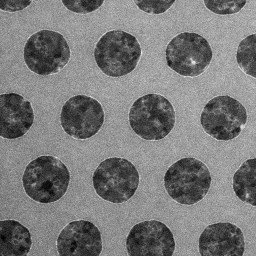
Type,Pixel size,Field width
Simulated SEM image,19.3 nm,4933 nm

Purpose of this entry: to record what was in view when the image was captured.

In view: a regular array of raised bodies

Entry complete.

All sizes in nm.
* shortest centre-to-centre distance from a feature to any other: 1360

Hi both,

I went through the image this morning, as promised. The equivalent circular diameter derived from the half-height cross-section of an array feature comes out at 0.904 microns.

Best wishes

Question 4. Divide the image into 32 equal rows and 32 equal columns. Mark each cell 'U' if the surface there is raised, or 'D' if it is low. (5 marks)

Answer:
UUUUDDDDUUUUUDDDDUUUUUDDDDUUUUUD
DUDDDDDDDUUUDDDDDDUUUDDDDDDUUUDD
DDDDDDDDDDDDDDDDDDDDDDDDDDDDDDDD
DDDDDDDDDDDDDDDDDDDDDDDDDDDDDDDD
DDDDUUUUDDDDDUUUUDDDDDUUUDDDDDDU
DDDUUUUUUDDDUUUUUDDDDUUUUUDDDDUU
DDDUUUUUUDDDUUUUUUDDDUUUUUUDDDUU
DDDUUUUUUDDDUUUUUDDDDUUUUUDDDDUU
DDDDUUUDDDDDUUUUUDDDDUUUUUDDDDUU
DDDDDDDDDDDDDUUDDDDDDDDUUDDDDDDU
DDDDDDDDDDDDDDDDDDDDDDDDDDDDDDDD
DDDDDDDDDDDDDDDDDDDDDDDDDDDDDDDD
UUUDDDDDUUUUDDDDDUUUUDDDDDUUUUDD
UUUUDDDDUUUUUDDDUUUUUUDDDUUUUUUD
UUUUDDDDUUUUUDDDUUUUUUDDDUUUUUUD
UUUUDDDDUUUUUDDDUUUUUUDDDUUUUUDD
UUUDDDDDUUUUDDDDDUUUUDDDDDUUUUDD
DDDDDDDDDDDDDDDDDDUUDDDDDDDUUDDD
DDDDDDDDDDDDDDDDDDDDDDDDDDDDDDDD
DDDDDUUDDDDDDDDDDDDDDDDDDDDDDDDD
DDDDUUUUDDDDUUUUUDDDDDUUUUDDDDUU
DDDUUUUUUDDDUUUUUDDDDUUUUUDDDUUU
DDDUUUUUUDDDUUUUUDDDDUUUUUDDDUUU
DDDUUUUUUDDDUUUUUDDDDUUUUUDDDUUU
DDDDUUUUDDDDUUUUUDDDDUUUUUDDDDUU
DDDDDDDDDDDDDDDDDDDDDDDUDDDDDDDU
DDDDDDDDDDDDDDDDDDDDDDDDDDDDDDDD
DDDDDDDDDDDDDDDDDDUDDDDDDDDDDDDD
UUUDDDDDUUUUDDDDUUUUUDDDDDUUUUDD
UUUUDDDUUUUUUDDDUUUUUUDDDUUUUUDD
UUUUDDDUUUUUUDDDUUUUUUDDDUUUUUUD
UUUUDDDUUUUUUDDDUUUUUUDDDUUUUUDD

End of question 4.